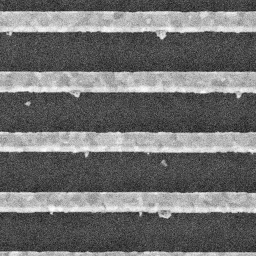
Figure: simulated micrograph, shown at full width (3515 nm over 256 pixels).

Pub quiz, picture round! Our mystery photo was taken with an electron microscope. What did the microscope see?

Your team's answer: lines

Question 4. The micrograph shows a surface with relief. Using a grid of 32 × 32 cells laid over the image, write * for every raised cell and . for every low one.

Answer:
................................
................................
********************************
********************************
................................
................................
................................
................................
................................
********************************
********************************
................................
................................
................................
................................
................................
................................
********************************
********************************
................................
................................
................................
................................
................................
********************************
********************************
................................
................................
................................
................................
................................
................................